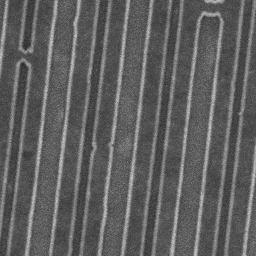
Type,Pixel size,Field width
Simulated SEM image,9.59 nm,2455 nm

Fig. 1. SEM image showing parallel lines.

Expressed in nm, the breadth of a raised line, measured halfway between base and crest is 179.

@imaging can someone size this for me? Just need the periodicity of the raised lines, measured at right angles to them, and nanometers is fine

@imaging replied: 350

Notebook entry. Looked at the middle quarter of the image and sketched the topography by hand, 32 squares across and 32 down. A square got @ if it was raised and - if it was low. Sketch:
--@@@@@---@@@@------@@@@@---@@@@
--@@@@@---@@@@------@@@@@---@@@@
--@@@@---@@@@@------@@@@----@@@@
--@@@@---@@@@@------@@@@---@@@@@
--@@@@---@@@@@------@@@@---@@@@@
--@@@@---@@@@@------@@@@---@@@@@
-@@@@@---@@@@@-----@@@@@---@@@@@
-@@@@@---@@@@------@@@@@---@@@@-
-@@@@@---@@@@------@@@@@---@@@@-
-@@@@@---@@@@------@@@@@---@@@@-
-@@@@@---@@@@------@@@@@---@@@@-
-@@@@@--@@@@@------@@@@@--@@@@@-
-@@@@---@@@@@------@@@@@--@@@@@-
-@@@@---@@@@@------@@@@---@@@@@-
@@@@@---@@@@@------@@@@---@@@@@-
@@@@@---@@@@------@@@@@---@@@@@-
@@@@@---@@@@------@@@@@---@@@@--
@@@@@---@@@@------@@@@@---@@@@--
@@@@@---@@@@------@@@@@---@@@@--
@@@@----@@@@------@@@@----@@@@--
@@@@----@@@-------@@@@---@@@@@--
@@@@----@@@@------@@@@---@@@@@--
@@@@---@@@@@------@@@@---@@@@@--
@@@@---@@@@@------@@@@---@@@@@--
@@@@---@@@@------@@@@@---@@@@@--
@@@@---@@@@------@@@@@---@@@@@--
@@@@---@@@@------@@@@@---@@@@---
@@@@---@@@@------@@@@@---@@@@---
@@@---@@@@@------@@@@----@@@@---
@@@---@@@@@------@@@@---@@@@@---
@@@---@@@@@------@@@@---@@@@@---
@@@---@@@@@------@@@@---@@@@@---